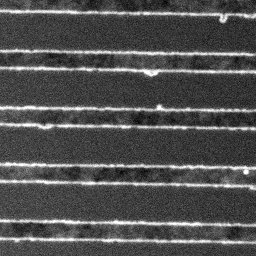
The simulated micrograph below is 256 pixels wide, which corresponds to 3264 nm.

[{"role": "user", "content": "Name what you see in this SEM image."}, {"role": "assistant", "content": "lines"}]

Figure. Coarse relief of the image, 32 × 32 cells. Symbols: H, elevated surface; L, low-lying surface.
HHHHHHHHHHHHHHHHHHHHHHHHHHHHHHHH
LLLLLLLLLHHHHHHHHHHHHHHHHHHHHHHH
LLLLLLLLLLLLLLLLLLLLLLLLLLLLLLLL
LLLLLLLLLLLLLLLLLLLLLLLLLLLLLLLL
LLLLLLLLLLLLLLLLLLLLLLLLLLLLLLLL
LLLLLLLLLLLLLLLLLLLLLLLLLLLLLLLL
HHHHHHHHHHHHHHLLLLLLLLLLLLLLLLLL
HHHHHHHHHHHHHHHHHHHHHHHHHHHHHHHH
HHHHHHHHHHHHHHHHHHHHHHHHHHHHHHHH
LLLLLLLLLLLLLLLLLLLLLLLLLLLLLLLL
LLLLLLLLLLLLLLLLLLLLLLLLLLLLLLLL
LLLLLLLLLLLLLLLLLLLLLLLLLLLLLLLL
LLLLLLLLLLLLLLLLLLLLLLLLLLLLLLLL
LHLHHLLLLLLLLLLLLLLLLLLLLLLLLLLL
HHHHHHHHHHHHHHHHHHHHHHHHHHHHHHHH
HHHHHHHHHHHHHHHHHHHHHHHHHHHHHHHH
LLLLLLLLLLLLLLLLLLLLLLLLLLLLLLLL
LLLLLLLLLLLLLLLLLLLLLLLLLLLLLLLL
LLLLLLLLLLLLLLLLLLLLLLLLLLLLLLLL
LLLLLLLLLLLLLLLLLLLLLLLLLLLLLLLL
HHLLLLLLLLLLLLLLLLLLLLLLLLLLLLLL
HHHHHHHHHHHHHHHHHHHHHHHHHHHHHHHH
HHHHHHHHHHHHHHHHHHHHHHHHHHHHHHHH
LLLLLLLLLLLLLLLLLLLLLLLLLLLLLLLH
LLLLLLLLLLLLLLLLLLLLLLLLLLLLLLLL
LLLLLLLLLLLLLLLLLLLLLLLLLLLLLLLL
LLLLLLLLLLLLLLLLLLLLLLLLLLLLLLLL
LLLLLLLLLLLLLLLLLLLLLLLLLLLLLLLL
HHHHHHHHHHHHHHHHHHHHHHHHHHHHHHHH
HHHHHHHHHHHHHHHHHHHHHHHHHHHHHHHH
LLLLLLLLLLLLLLLLLLLLLLLLLLLLLLLL
LLLLLLLLLLLLLLLLLLLLLLLLLLLLLLLL